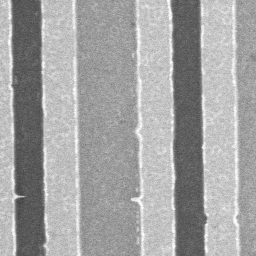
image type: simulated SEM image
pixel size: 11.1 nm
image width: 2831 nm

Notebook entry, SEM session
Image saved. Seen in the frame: one or a few lines or trenches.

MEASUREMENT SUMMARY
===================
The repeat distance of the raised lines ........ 881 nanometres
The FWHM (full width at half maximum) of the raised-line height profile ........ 34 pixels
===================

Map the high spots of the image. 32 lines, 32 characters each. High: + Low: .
+....++++........++++....++++...
+....++++........++++....++++...
+....++++........+++++...++++...
+....++++........+++++...++++...
+....++++........++++....++++...
+....++++........+++++...++++...
+....++++........+++++...++++...
+....++++........+++++...++++...
+....++++........+++++...++++...
+....++++........++++....++++...
++...++++........++++....++++...
++...++++........+++++...++++...
++...+++++.......+++++...++++...
++...+++++.......+++++...++++...
++...+++++.......+++++...++++...
++...+++++.......+++++...++++...
++...+++++.......+++++...+++++..
++...+++++.......+++++...+++++..
++...+++++.......+++++...+++++..
++...+++++.......+++++...+++++..
++...+++++.......+++++...+++++..
++....++++.......+++++...+++++..
++....++++........++++...+++++..
++....++++........++++...+++++..
++....++++.......+++++....++++..
++....++++.......+++++....++++..
++....++++........++++....++++..
++....++++........++++....+++...
++....++++........++++....++++..
++....++++........++++....++++..
++....++++........++++....++++..
++....++++........++++....++++..